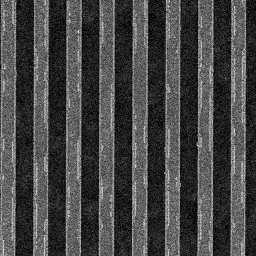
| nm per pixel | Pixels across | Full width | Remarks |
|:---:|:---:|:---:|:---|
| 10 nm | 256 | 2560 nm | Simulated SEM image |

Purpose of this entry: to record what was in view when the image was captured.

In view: parallel lines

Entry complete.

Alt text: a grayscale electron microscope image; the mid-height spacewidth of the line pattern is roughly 195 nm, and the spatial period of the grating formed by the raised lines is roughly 329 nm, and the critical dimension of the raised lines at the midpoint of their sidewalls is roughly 137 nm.